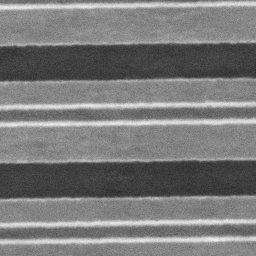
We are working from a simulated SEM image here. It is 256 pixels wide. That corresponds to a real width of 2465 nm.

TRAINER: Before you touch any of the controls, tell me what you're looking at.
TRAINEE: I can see lines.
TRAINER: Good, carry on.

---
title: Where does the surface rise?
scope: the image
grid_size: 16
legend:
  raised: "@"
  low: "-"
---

@@@@@@@@@@@@@@@@
@@@@@@@@@@@@@@@@
@@@@@@@@@@@@@@@@
----------------
----------------
@@@@@@@@@@@@@@@@
@@@@@@@@@@@@@@@@
@@@@@@@@@@@@@@@@
@@@@@@@@@@@@@@@@
@@@@@@@@@@@@@@@@
----------------
----------------
@@@@@@@@@@@@@@@@
@@@@@@@@@@@@@@@@
@@@@@@@@@@@@@@@@
@@@@@@@@@@@@@@@@